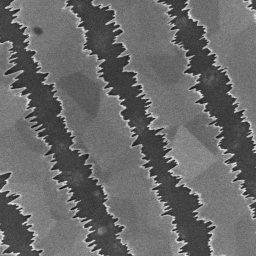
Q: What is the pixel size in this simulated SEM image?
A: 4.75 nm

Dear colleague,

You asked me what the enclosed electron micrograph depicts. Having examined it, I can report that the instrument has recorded one or a few lines or trenches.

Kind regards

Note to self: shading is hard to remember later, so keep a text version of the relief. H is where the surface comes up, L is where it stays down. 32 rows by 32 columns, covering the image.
LHHHHHHHLLLLHHHHHHHHHLLHHHHHHHHL
LLHHHHHHHLLLLLHHHHHHHLLHHHHHHHHH
LLHHHHHHHHLLLLHHHHHHHLLLHHHHHHHH
LLLHHHHHHHLLLLLHHHHHHHLLLHHHHHHH
LLLHHHHHHHHLLLLHHHHHHHLLLLHHHHHH
HLLHHHHHHHHLLLLHHHHHHHLLLLHHHHHH
HLLLHHHHHHHLLLLHHHHHHHHLLLHHHHHH
HLLLHHHHHHHHLLLLHHHHHHHHLLLHHHHH
HLLLLHHHHHHHLLLLHHHHHHHLLLLHHHHH
HHLLLLHHHHHHHLLLLHHHHHHHHLLLHHHH
HHLLLLHHHHHHHLLLLHHHHHHHLLLLLHHH
HHHLLLLHHHHHHHLLLLHHHHHHHLLLLHHH
HHHHLLLHHHHHHHHLLLHHHHHHHLLLLHHH
HHHHLLLLHHHHHHHLLLHHHHHHHHLLLLHH
HHHHLLLLHHHHHHHLLLLHHHHHHHLLLLHH
HHHHLLLLHHHHHHHHLLLHHHHHHHHLLLLH
HHHHHLLLLHHHHHHHHLLLHHHHHHHHLLLH
HHHHHHLLLHHHHHHHHLLLLHHHHHHLLLLL
HHHHHHLLLHHHHHHHHHLLLHHHHHHHLLLL
HHHHHHHLLLLHHHHHHHLLLHHHHHHHHLLL
HHHHHHHLLLLHHHHHHHLLLLHHHHHHHLLL
HHHHHHHLLLLHHHHHHHHLLHHHHHHHHHLL
LHHHHHHLLLLLHHHHHHHLLLHHHHHHHHLL
HHHHHHHHLLLLLHHHHHHHLLLHHHHHHHLL
LLHHHHHHHLLLLHHHHHHHLLLLLHHHHHHL
LLHHHHHHHLLLLHHHHHHHLLLLLHHHHHHL
LLLHHHHHHLLLLLHHHHHHHLLLLHHHHHHH
LLLHHHHHHHLLLLHHHHHHHHLLLHHHHHHH
LLLLHHHHHHHLLLLHHHHHHHLLLLHHHHHH
LLLLHHHHHHHLLLLHHHHHHHLLLLHHHHHH
HLLLHHHHHHHLLLLLHHHHHHHLLLHHHHHH
HLLLLHHHHHHHLLLLHHHHHHHLLLHHHHHH